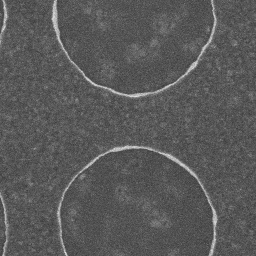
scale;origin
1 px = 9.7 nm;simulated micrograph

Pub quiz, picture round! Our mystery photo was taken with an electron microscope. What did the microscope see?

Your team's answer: holes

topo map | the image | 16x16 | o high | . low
oooo.........ooo
oooo.........ooo
oooo.........ooo
oooo........oooo
ooooo.......oooo
ooooooo...oooooo
oooooooooooooooo
oooooooooooooooo
oooooooooooooooo
ooooooo...oooooo
ooooo......ooooo
oooo........oooo
oooo.........ooo
oooo.........ooo
oooo.........ooo
oooo.........ooo